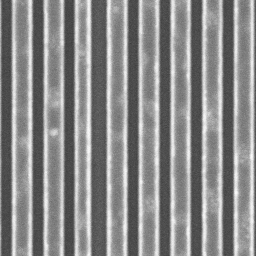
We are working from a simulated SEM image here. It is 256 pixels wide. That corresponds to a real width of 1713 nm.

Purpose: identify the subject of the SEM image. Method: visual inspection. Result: parallel lines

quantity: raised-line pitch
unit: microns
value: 0.212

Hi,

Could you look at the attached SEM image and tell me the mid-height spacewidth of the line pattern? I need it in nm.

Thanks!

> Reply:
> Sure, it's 84.4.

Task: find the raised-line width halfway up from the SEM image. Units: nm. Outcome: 124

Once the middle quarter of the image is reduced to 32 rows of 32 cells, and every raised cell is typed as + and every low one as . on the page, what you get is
...++++....+++++...+++++...++++.
...+++.....+++++...+++++...++++.
...+++.....+++++...+++++...++++.
...+++.....+++++...+++++...++++.
...+++.....+++++...+++++...++++.
...+++.....+++++...+++++...++++.
...+++.....+++++...+++++...++++.
...+++.....+++++...+++++...++++.
...+++.....+++++...+++++...++++.
...+++.....+++++...+++++...++++.
...+++.....+++++...+++++...++++.
...+++.....+++++...+++++...++++.
...+++.....+++++...+++++...++++.
...+++.....+++++...+++++...++++.
...+++.....+++++...+++++...++++.
...+++.....+++++...+++++...++++.
...+++.....+++++...+++++...++++.
...+++.....+++++...+++++...++++.
...+++.....+++++...+++++...++++.
...+++.....+++++...+++++...++++.
...++++....+++++...+++++...++++.
...++++....+++++...+++++...++++.
...++++....+++++...+++++...++++.
...+++.....+++++...+++++...++++.
...+++.....+++++...+++++...++++.
...+++.....+++++...+++++...++++.
...+++.....+++++...+++++...++++.
...+++.....+++++...+++++...++++.
...+++.....+++++...+++++...++++.
...+++.....+++++...+++++...++++.
...+++.....+++++...+++++...++++.
...+++.....+++++...+++++...++++.